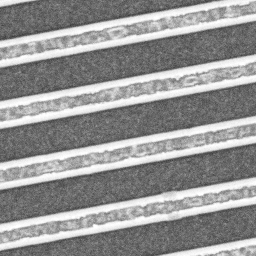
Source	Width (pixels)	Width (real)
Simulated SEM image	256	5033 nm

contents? parallel lines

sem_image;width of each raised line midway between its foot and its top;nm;406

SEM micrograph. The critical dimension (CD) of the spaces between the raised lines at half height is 776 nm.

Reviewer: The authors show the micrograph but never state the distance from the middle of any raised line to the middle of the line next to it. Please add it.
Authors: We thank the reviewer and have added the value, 1180 nm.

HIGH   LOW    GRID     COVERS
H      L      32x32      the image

LLLLLLLLLLLLLLLLLLLLLLLLLLLLHHHH
LLLLLLLLLLLLLLLLLLLLLLHHHHHHHHHH
LLLLLLLLLLLLLLLLHHHHHHHHHHHHHHLL
LLLLLLLLLLLHHHHHHHHHHHHHHLLLLLLL
LLLLLLHHHHHHHHHHHHHHLLLLLLLLLLLL
HHHHHHHHHHHHHLLLLLLLLLLLLLLLLLLL
HHHHHHHHHLLLLLLLLLLLLLLLLLLLLLLL
HHHLLLLLLLLLLLLLLLLLLLLLLLLLLLLH
LLLLLLLLLLLLLLLLLLLLLLLLLHHHHHHH
LLLLLLLLLLLLLLLLLLLLHHHHHHHHHHHH
LLLLLLLLLLLLLLHHHHHHHHHHHHHHHLLL
LLLLLLLLLHHHHHHHHHHHHHHLLLLLLLLL
LLLHHHHHHHHHHHHHHHLLLLLLLLLLLLLL
HHHHHHHHHHHHLLLLLLLLLLLLLLLLLLLL
HHHHHHHLLLLLLLLLLLLLLLLLLLLLLLLL
HLLLLLLLLLLLLLLLLLLLLLLLLLLLLHHH
LLLLLLLLLLLLLLLLLLLLLLLHHHHHHHHH
LLLLLLLLLLLLLLLLLLHHHHHHHHHHHHHL
LLLLLLLLLLLLHHHHHHHHHHHHHHLLLLLL
LLLLLLLHHHHHHHHHHHHHHLLLLLLLLLLL
LHHHHHHHHHHHHHHHLLLLLLLLLLLLLLLL
HHHHHHHHHHLLLLLLLLLLLLLLLLLLLLLL
HHHHHLLLLLLLLLLLLLLLLLLLLLLLLLLL
LLLLLLLLLLLLLLLLLLLLLLLLLLLHHHHH
LLLLLLLLLLLLLLLLLLLLLHHHHHHHHHHH
LLLLLLLLLLLLLLLLHHHHHHHHHHHHHHLL
LLLLLLLLLLHHHHHHHHHHHHHHLLLLLLLL
LLLLLHHHHHHHHHHHHHHLLLLLLLLLLLLL
HHHHHHHHHHHHHLLLLLLLLLLLLLLLLLLL
HHHHHHHHLLLLLLLLLLLLLLLLLLLLLLLL
HHLLLLLLLLLLLLLLLLLLLLLLLLLLLLHH
LLLLLLLLLLLLLLLLLLLLLLLLHHHHHHHH